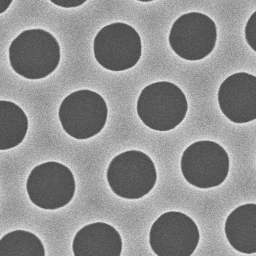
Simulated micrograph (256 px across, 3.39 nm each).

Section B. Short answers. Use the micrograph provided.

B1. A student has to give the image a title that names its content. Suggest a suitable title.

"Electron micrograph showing a regular array of holes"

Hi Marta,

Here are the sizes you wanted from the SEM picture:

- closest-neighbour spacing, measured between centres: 254 nm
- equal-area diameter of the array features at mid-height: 165 nanometers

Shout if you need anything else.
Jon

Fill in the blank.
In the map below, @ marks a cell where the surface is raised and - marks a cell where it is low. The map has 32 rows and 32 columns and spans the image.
-@@@@@@---@@@@@@@@@@@@@@@@@@@@@@
@@@@@@@@@@@@@@@@@@@@@@@@@@@@@@@@
@@@@@@@@@@@@@@@@@@@@@@----@@@@@-
@@@@@@@@@@@@@----@@@@------@@@@-
@@-----@@@@@-----@@@@------@@@@-
@------@@@@@------@@@------@@@@-
@-------@@@@------@@@@----@@@@@@
@------@@@@@-----@@@@@@@-@@@@@@@
@@-----@@@@@@---@@@@@@@@@@@@@@@@
@@@---@@@@@@@@@@@@@@@@@@@@@@@---
@@@@@@@@@@@@@@@@@@@---@@@@@@----
@@@@@@@@@---@@@@@@-----@@@@-----
@@@@@@@@-----@@@@------@@@@-----
---@@@@------@@@@------@@@@@----
---@@@@------@@@@------@@@@@----
---@@@@@-----@@@@@----@@@@@@@@@@
---@@@@@----@@@@@@@@@@@@@@@@@@@@
---@@@@@@@@@@@@@@@@@@@@@@@@@@@@@
-@@@@@@@@@@@@@@@@@@@@@@-----@@@@
@@@@@@@@@@@@@@@---@@@@@------@@@
@@@@@---@@@@@@-----@@@@------@@@
@@@@-----@@@@------@@@@-----@@@@
@@@------@@@@-------@@@-----@@@@
@@@------@@@@@-----@@@@@@-@@@@@@
@@@@-----@@@@@@---@@@@@@@@@@@@@@
@@@@----@@@@@@@@@@@@@@@@@@@@@@@-
@@@@@@@@@@@@@@@@@@@@@-@@@@@@@---
@@@@@@@@@@@@@@@@@@@@----@@@@----
@@@@@@@@@@----@@@@@------@@@----
@---@@@@@------@@@@------@@@----
-----@@@@------@@@@------@@@@---
------@@@------@@@@-----@@@@@@--